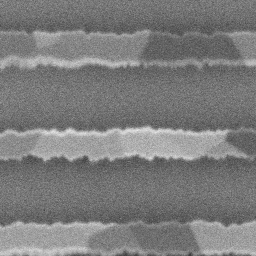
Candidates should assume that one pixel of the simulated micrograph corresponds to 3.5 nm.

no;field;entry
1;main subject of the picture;lines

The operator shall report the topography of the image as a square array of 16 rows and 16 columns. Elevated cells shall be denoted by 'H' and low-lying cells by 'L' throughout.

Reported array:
LLLLLLLLLLLLLLLL
LLLLLLLLLLLLLLLL
HHHHHHHHHHHHHHHH
HHHHHHHHHHHHHHHH
LLLLLLLLLLLLLLLL
LLLLLLLLLLLLLLLL
LLLLLLLLLLLLLLLL
LLLLLLLLLLLLLLLL
HHHHHHHHHHHHHHHH
HHHHHHHHHHHHHHHH
LLLLLLLLLLLLLLLL
LLLLLLLLLLLLLLLL
LLLLLLLLLLLLLLLL
LLLLLLLLLLLLLLLL
HHHHHHHHHHHHHHHH
HHHHHHHHHHHHHHHH